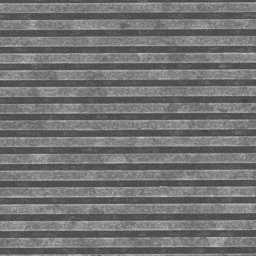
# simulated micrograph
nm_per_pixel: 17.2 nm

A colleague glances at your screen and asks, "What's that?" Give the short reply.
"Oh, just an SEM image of parallel lines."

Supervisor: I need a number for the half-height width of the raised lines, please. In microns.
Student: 0.153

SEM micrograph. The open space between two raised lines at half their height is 138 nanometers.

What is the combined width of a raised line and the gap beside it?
288 nm